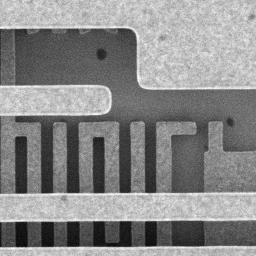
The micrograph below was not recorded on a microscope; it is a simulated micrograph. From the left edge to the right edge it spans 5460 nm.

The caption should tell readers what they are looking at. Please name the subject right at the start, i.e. wiring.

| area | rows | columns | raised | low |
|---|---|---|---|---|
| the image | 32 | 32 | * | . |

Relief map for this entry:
********************************
********************************
********************************
................****************
.................***************
.................***************
.................***************
.................***************
.................***************
.................***************
.................***************
**************..................
**************..................
**************..................
................................
................................
................................
................................
................................
................................
................................
................................
................................
................................
********************************
********************************
********************************
********************............
................................
................................
................................
********************************